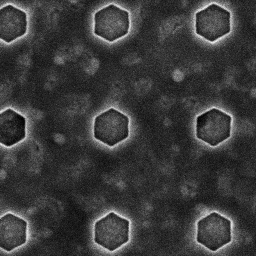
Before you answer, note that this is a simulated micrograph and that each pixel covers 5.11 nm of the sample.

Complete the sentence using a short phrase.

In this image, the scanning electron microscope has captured holes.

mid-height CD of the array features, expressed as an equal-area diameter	185	nm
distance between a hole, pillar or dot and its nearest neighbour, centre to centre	0.522	microns